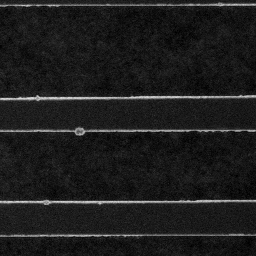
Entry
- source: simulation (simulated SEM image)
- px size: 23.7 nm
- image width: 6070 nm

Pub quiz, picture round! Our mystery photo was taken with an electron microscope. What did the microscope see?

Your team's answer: lines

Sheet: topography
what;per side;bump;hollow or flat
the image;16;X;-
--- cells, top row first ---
----------------
----------------
----------------
----------------
----------------
----------------
XXXXXXXXXXXXXXXX
XXXXXXXXXXXXXXXX
----------------
----------------
----------------
----------------
----------------
XXXXXXXXXXXXXXXX
XXXXXXXXXXXXXXXX
----------------